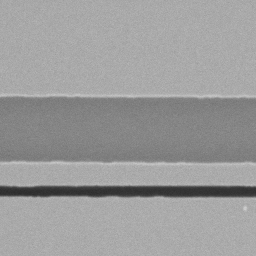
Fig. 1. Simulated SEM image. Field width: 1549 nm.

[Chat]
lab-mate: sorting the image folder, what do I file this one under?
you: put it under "lines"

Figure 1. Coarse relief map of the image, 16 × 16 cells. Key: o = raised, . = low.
oooooooooooooooo
oooooooooooooooo
oooooooooooooooo
oooooooooooooooo
oooooooooooooooo
oooooooooooooooo
................
................
................
................
oooooooooooooooo
oooooooooooooooo
oooooooooooooooo
oooooooooooooooo
oooooooooooooooo
oooooooooooooooo